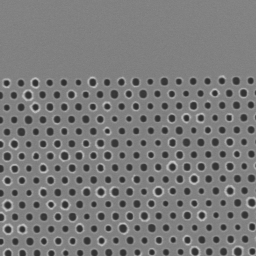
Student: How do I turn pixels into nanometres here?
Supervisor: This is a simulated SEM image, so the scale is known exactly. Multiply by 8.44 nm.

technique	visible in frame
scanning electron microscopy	a regular array of holes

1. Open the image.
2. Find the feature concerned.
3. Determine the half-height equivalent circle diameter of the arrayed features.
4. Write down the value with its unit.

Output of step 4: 54.7 nm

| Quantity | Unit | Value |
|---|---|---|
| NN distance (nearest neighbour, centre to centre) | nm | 117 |